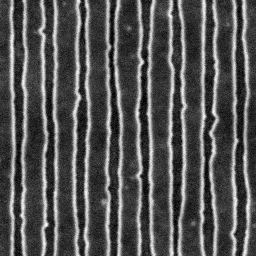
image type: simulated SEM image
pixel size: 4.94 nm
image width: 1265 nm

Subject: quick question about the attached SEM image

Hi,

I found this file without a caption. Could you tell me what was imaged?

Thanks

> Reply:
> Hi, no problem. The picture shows parallel lines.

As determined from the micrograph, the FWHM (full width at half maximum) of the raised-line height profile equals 22.1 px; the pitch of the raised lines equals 156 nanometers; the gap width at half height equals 50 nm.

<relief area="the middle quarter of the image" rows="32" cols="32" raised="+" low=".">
++++..+++++..++++++..++++++...++
++++..+++++..++++++..++++++...++
++++..+++++..++++++..++++++...++
+++...+++++..++++++..++++++...++
+++..++++++..++++++..++++++...++
+++..++++++..++++++..++++++...++
+++...+++++..++++++..++++++...++
+++...+++++...+++++..++++++...++
++++..+++++...+++++..++++++...++
+++...+++++...+++++..++++++...++
+++...+++++...+++++..++++++...++
+++...+++++...++++...++++++...++
+++...+++++...++++...++++++...++
+++...+++++...++++...++++++...++
+++...+++++...+++++..++++++...++
+++...+++++...+++++..++++++...++
+++...+++++...+++++..++++++...++
+++...+++++...+++++..++++++...++
+++...+++++...+++++...+++++...++
+++...+++++...+++++...+++++...++
+++...+++++...+++++...+++++...++
+++...+++++...+++++...+++++...++
+++...+++++...+++++...+++++...++
+++...+++++...+++++...+++++...++
++....+++++...+++++...+++++...++
+++...+++++...+++++...+++++...++
++....+++++...+++++..++++++...++
+++...+++++...+++++..++++++...++
+++...+++++...+++++..++++++...++
+++..++++++...+++++...+++++...++
+++..++++++...+++++...+++++...++
+++..++++++...+++++...+++++...++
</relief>